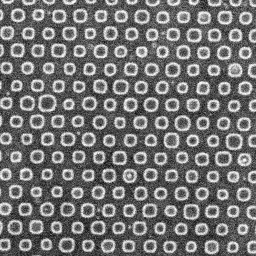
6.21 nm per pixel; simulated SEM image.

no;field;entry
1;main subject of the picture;a regular array of raised bodies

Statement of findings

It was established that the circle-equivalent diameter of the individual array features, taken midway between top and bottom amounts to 76.7 nm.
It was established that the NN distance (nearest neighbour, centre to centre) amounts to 0.124 micrometres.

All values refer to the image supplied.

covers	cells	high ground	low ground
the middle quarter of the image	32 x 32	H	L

HHHLLHHHLLLHHLLHHHLLLHHLLLHHHLLL
HHHLLHHHLLHHHLLHHHLLHHHLLLHHHLLH
LLLLLHHLLLHHHLLLHHLLLHHLLLHHHLLH
LLLLLLLLLLLLLLLLLLLLLLLLLLLLLLLL
LLLLLLLLHHLLLHHHLLHHLLLLLLLLLLLL
LLLHHLLLHHLLLHHHLLHHHLLHHHLLLHHL
LLLHHLLLHHLLLHHHLLHHHLLHHHLLLHHL
LLLLLLLLLLLLLLLLLLLLLLLLLLLLLLLL
LLLLLLHLLLLLLLLLLLLLLLLLLLLLLLLL
HHLLLHHHLLHHHLLHHHLLHHHLLLHHLLLH
HHLLLHHHLLHHHLLHHHLLHHHLLLHHLLLH
LLLLLLLLLLLLLLLLHHLLLHHLLLHHLLLH
LLLLLLLLLLLLLLLLLLLLLLLLLLLLLLLL
LLLHHLLLHHLLLLLLLLHHLLLLHLLLHHHL
LLHHHLLHHHLLLHHLLLHHHLLHHHLLHHHL
LLLHLLLLHHLLLHHLLLHHHLLHHHLLHHHL
LLLLLLLLLLLLLLLLLLLLLLLLLLLLLHHL
HHLLLHHLLLLLLLLLLLLLLLLLLLHHLLLL
HHLLLHHHLLHHHLLHHHLLHHHLLHHHHLLH
HHLLLHHHLLHHHLLHHHLLHHHLLHHHHLLH
LLLLLLLLLLLLLLLLLLLLLLLLLHHHLLLL
LLLLLLLLLLLLLLLLLLLLLLLLLLLLLLLL
LLHHHLLLHHLLHHHLLLHHLLLHHLLLLHHL
LLHHHLLLHHLLHHHLLLHHLLLHHLLLHHHL
LLLHLLLLHHLLHHHLLLHHLLLHHLLLLHLL
LLLLLLLLLLLLLLLLLLLLLLLLLLLLLLLL
LLLLLLLLLLHHLLLLLLLLLHHLLLLLLLLL
HHLLLHHLLLHHHLLHHHLLHHHLLLHHLLLH
HHLLLHHLLLHHHLLHHHLLHHHLLLHHLLLH
LLLLLLLLLLLLLLLLLLLLLLLLLLLLLLLL
LLLLLLLLLLLLLLLLLLLLLLLLLLLLLLLL
LLHHHLLHHHLLHHHLLLHHHLLHHLLLHHHL